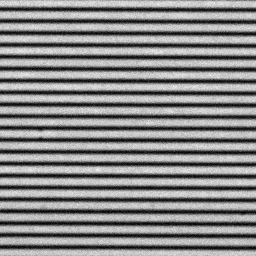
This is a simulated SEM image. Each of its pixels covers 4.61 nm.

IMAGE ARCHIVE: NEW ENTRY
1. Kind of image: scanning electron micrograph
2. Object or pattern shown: parallel lines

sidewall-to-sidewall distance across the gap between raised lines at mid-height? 17.9 nanometres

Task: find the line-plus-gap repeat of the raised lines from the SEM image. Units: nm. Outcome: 54.9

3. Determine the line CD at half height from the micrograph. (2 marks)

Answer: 35.8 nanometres